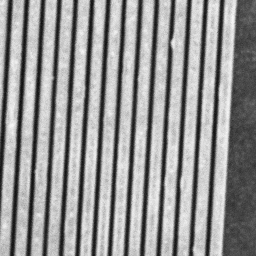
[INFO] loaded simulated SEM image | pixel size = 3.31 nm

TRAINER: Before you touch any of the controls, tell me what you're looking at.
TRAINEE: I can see parallel lines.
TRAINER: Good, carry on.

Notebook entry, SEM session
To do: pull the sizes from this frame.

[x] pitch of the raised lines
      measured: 53.8 nanometers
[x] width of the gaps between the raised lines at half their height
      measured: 17.8 nanometers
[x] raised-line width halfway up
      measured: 11.5 pixels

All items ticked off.